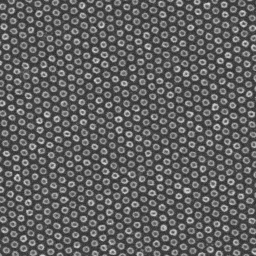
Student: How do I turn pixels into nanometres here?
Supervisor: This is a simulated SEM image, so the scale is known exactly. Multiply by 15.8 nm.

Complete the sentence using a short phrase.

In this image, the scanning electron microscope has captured a regular array of raised bodies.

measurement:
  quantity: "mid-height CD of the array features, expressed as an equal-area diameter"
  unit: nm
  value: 95.8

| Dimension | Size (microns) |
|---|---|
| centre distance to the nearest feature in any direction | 0.154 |